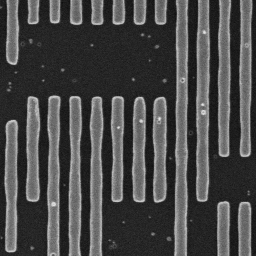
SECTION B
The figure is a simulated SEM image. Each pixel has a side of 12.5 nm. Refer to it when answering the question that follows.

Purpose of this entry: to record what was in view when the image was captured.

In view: wiring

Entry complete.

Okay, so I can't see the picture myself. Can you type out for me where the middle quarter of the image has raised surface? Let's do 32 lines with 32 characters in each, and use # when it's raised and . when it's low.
............................###.
............................###.
............................###.
............................###.
............................###.
............................###.
............................###.
............................###.
.###...##...###...##...##...###.
.###...##...###...##...##...###.
.###...##...###...##...###..###.
.###...##...###...##..####..###.
.###...##...###...##..####..###.
.###...###..###..###..####..###.
.###...###..###..###..####..###.
.###...###..###..###..####..###.
.###...###..###..###..####..###.
.###...##...###..###..####..###.
..##...##...###..###..###...###.
..##...##...###..###..####..###.
..##...##...###..###...###..###.
..##...##...###..###...##...###.
..##...##...###..###...##...###.
..##...##...###..###...##...###.
..##...##...###..###...##...###.
..##...##...###..###...##...###.
..##...##...###..###...##...###.
.###...##...###..###...##...##..
.###...##...###..###..###...##..
.###...##...###..###..####..###.
.###...##...###..###..####..###.
.###...##...###..###..####..###.